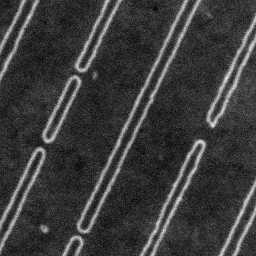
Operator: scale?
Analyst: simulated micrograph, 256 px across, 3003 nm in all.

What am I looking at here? one or a few lines or trenches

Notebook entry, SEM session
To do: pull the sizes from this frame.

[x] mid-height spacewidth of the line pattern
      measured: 702 nm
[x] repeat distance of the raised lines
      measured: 830 nm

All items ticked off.